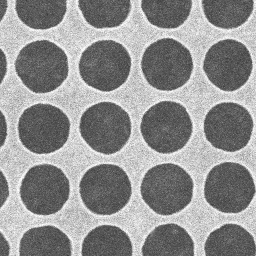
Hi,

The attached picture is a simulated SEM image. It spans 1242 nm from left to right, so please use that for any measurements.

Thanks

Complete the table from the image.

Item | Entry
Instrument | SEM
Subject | a regular array of holes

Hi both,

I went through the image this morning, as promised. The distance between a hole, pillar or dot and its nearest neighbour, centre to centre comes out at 297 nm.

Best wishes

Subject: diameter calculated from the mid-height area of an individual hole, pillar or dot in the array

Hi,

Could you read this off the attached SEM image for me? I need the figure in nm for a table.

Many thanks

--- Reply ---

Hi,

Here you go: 253